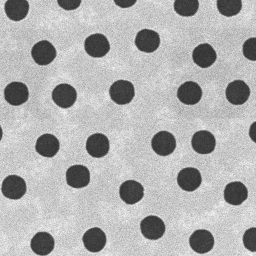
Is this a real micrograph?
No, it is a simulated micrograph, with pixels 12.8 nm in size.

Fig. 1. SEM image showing a regular array of holes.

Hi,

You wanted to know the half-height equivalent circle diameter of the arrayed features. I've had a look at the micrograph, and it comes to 315 nanometers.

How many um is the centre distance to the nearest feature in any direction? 0.576